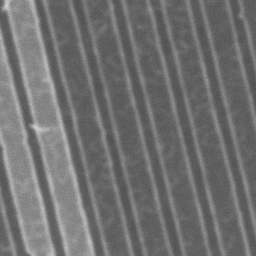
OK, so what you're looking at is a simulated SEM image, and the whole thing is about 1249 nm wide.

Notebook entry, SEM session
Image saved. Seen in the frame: parallel lines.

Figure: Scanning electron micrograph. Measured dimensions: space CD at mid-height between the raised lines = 0.0575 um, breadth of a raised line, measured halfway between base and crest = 128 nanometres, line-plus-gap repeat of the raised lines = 185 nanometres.